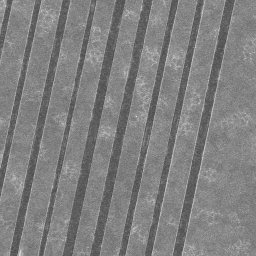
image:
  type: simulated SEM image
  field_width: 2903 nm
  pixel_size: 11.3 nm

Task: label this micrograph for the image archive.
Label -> parallel lines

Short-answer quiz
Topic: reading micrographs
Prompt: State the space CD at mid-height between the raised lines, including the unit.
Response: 81.9 nm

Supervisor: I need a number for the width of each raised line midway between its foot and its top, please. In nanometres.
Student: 207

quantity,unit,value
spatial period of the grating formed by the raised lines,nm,300